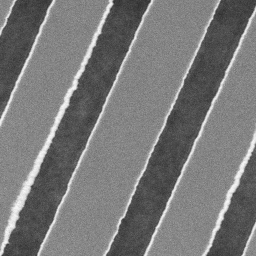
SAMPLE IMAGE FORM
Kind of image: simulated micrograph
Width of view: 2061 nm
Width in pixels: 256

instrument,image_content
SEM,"lines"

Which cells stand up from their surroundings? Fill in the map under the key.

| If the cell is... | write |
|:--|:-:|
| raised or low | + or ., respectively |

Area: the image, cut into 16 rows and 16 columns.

+..++++..+++++..
...+++...++++..+
..++++..+++++..+
..++++..++++...+
.++++..+++++..++
.++++..++++...++
++++...++++..+++
++++..++++...+++
+++...++++..++++
+++..+++++..++++
++...++++..++++.
++..+++++..++++.
++..++++...+++..
+..+++++..++++..
+..++++...++++..
...++++..++++..+